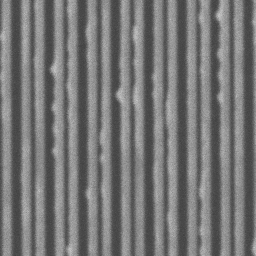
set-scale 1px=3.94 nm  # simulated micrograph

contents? parallel lines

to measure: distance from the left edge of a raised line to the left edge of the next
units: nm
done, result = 65.3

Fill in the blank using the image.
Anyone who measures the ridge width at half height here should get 30.5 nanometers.